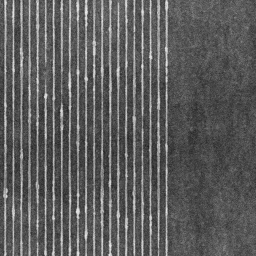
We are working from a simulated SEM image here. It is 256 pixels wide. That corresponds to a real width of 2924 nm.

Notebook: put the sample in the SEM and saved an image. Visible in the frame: parallel lines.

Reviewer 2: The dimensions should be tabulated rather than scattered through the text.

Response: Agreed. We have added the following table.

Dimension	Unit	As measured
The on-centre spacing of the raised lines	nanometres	92.1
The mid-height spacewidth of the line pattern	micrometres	0.0757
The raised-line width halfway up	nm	17.1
